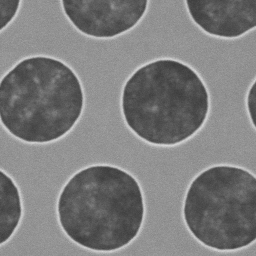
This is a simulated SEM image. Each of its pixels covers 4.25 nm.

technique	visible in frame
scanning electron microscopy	holes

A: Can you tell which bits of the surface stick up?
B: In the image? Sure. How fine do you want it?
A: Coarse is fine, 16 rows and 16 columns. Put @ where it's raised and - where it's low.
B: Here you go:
-@@@-----@@@----
@@@@@---@@@@----
@@@@@@@@@@@@@@@@
@@@@@@@@@@@@@@@@
@----@@@@---@@@@
-----@@@-----@@@
-----@@@-----@@@
-----@@@-----@@@
@---@@@@@---@@@@
@@@@@@@@@@@@@@@@
@@@@@@-@@@@@@--@
-@@@-----@@@----
-@@@-----@@@----
-@@@-----@@@----
-@@@-----@@@----
@@@@@@-@@@@@@--@